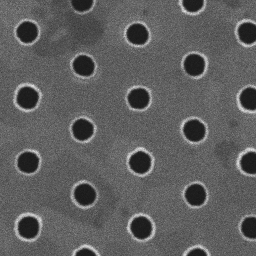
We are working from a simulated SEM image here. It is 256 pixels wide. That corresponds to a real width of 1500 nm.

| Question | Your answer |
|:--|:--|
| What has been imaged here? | a regular array of holes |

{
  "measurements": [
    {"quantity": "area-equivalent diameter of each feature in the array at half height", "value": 21.7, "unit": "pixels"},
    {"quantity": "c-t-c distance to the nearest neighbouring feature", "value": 374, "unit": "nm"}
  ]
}